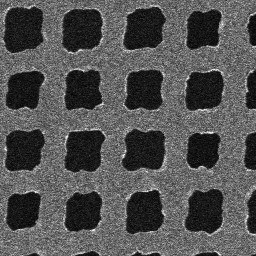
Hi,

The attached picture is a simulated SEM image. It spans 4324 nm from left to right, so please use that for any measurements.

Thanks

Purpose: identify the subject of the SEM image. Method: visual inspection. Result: a regular array of holes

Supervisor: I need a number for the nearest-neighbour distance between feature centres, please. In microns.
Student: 1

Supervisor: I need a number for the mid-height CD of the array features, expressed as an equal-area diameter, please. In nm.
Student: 706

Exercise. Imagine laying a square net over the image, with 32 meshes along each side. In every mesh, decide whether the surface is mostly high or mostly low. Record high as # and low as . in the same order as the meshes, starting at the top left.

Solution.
################################
#....####...####....####...#####
#....###.....###.....##.....###.
#....###.....###....###....####.
.....###.....###....###....####.
#....###....###.....###....####.
#.##############################
################################
################################
#....###.....###....####....###.
#....###.....###....###.....###.
#....###.....###....###.....###.
#....###.....###....###.....###.
#...####....####....###....####.
################################
################################
#....####....###....############
#.....##.....###.....###....###.
#....###.....###.....##....####.
#....###.....##......##....####.
#....###.....##.....####...####.
#########.######################
################################
################################
#....####...####....####....###.
#....###.....###....####....###.
#....###.....###....###.....###.
#....###.....###....###.....###.
#..#####....####....###....####.
################################
################################
###########.####################